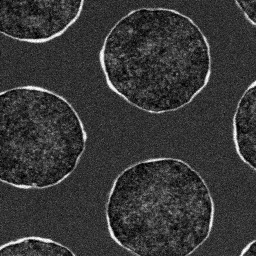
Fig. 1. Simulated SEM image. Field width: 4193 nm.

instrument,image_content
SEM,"holes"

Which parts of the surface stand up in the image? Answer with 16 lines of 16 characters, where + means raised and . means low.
.....++++++++++.
....+++.....++++
+++++++......+++
++++++.......+++
+++++++......+++
+++++++......+++
....++++....+++.
.....++++++++++.
.....++++++++++.
.....++++++++++.
.....+++....++++
+..++++......+++
+++++++......+++
+++++++......+++
+++++++......+++
....++++....++++